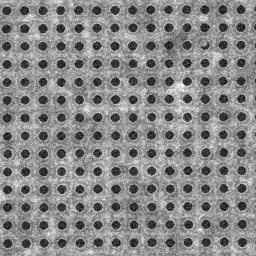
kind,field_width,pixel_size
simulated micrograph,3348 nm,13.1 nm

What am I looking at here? a regular array of holes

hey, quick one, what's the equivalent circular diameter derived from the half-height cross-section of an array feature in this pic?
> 131 nm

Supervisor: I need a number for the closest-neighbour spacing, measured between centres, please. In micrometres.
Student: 0.231